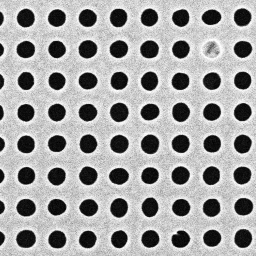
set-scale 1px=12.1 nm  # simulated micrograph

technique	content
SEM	a regular array of holes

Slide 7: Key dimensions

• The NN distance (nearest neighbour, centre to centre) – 370 nanometers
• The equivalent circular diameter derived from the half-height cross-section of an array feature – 218 nm